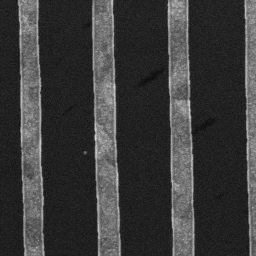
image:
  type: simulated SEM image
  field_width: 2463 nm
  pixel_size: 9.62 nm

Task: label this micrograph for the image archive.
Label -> lines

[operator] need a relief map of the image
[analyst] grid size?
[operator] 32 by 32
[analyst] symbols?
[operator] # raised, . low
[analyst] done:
..###.......##.......##........#
..###.......##.......##........#
..###.......##.......##........#
...##.......##.......##........#
...##.......##.......##........#
...##.......##.......##........#
...##.......##.......##........#
...##.......##.......##........#
...##.......##.......###.......#
...##.......##.......###.......#
...##.......##.......###.......#
...##.......##.......###.......#
...##.......##.......###.......#
...##.......##.......###.......#
...##.......##.......###.......#
...##.......##.......###.......#
...##.......##.......###.......#
...##.......##.......###.......#
...##.......##.......###.......#
...##.......##.......###.......#
...##.......###......###.......#
...##.......###......###.......#
...##.......###.......##.......#
...##.......###.......##.......#
...##.......###.......##.......#
...##.......###.......##.......#
...##.......###.......##.......#
...##.......###.......##.......#
...##.......###.......##.......#
...##.......###.......##.......#
...##.......###.......##.......#
...##.......###.......##.......#